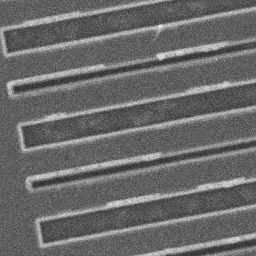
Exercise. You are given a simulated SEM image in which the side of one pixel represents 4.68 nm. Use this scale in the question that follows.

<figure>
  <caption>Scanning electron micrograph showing parallel lines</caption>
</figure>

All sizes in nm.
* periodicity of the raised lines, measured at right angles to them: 218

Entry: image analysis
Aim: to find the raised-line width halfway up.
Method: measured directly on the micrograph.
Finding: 146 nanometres